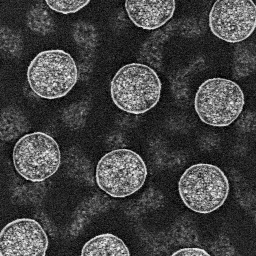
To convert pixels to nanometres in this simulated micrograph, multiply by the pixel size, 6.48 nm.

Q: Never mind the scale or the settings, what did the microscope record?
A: raised bodies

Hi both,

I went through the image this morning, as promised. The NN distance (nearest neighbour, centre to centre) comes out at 0.545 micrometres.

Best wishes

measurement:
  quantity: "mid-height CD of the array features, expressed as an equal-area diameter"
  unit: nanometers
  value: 314